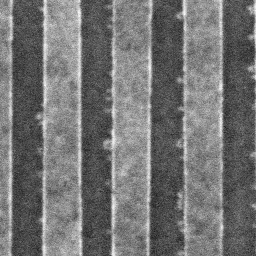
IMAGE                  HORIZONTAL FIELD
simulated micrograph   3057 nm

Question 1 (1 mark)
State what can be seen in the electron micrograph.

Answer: lines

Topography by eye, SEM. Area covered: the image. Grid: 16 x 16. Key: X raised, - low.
X--XX--XX--XXX--
X--XX--XX---XX--
X--XX--XX---XX--
X--XX--XX---XX--
X--XX--XX---XX--
X--XX--XX---XX--
X--XX--XX---XX--
X--XX--XX--XXX--
X--XX--XX---XX--
X--XX--XX---XX--
X--XX--XX---XX--
X--XX--XX---XX--
X--XX--XX---XX--
X--XX--XX---XX--
X--XX--XX---XX--
X--XX--XX---XX--